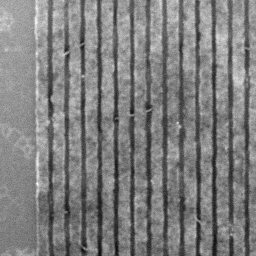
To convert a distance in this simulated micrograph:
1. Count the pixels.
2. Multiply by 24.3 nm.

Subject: parallel lines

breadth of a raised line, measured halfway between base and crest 264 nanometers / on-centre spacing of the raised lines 398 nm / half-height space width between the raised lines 130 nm